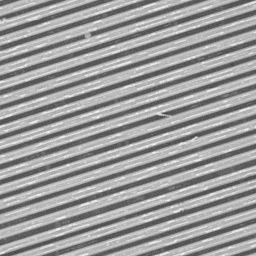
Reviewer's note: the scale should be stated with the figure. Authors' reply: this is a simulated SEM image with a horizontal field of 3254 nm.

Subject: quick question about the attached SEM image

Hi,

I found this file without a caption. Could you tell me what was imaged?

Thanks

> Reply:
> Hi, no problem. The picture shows parallel lines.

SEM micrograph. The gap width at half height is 93.9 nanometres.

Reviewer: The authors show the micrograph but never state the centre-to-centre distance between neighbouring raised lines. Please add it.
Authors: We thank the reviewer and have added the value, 180 nanometers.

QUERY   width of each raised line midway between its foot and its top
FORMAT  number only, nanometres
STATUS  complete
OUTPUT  81.9